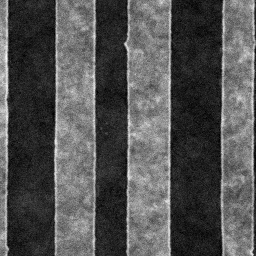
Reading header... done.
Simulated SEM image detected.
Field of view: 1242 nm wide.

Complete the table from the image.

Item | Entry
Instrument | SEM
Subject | one or a few lines or trenches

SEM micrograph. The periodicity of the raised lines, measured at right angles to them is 395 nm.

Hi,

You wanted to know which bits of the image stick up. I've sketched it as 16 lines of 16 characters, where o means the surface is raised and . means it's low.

....oo..ooo...oo
....oo..ooo...oo
....oo..ooo...oo
....oo..ooo...oo
....oo..ooo...oo
....oo..ooo...oo
....oo..ooo...oo
...ooo..ooo...oo
...ooo..ooo...oo
...ooo..ooo...oo
...ooo..ooo...oo
...ooo..ooo...oo
...ooo..ooo...oo
...ooo..ooo...oo
...ooo..ooo...oo
...ooo..ooo...oo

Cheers